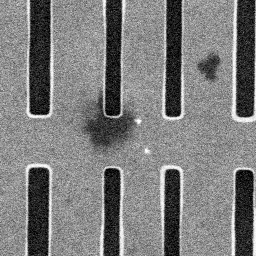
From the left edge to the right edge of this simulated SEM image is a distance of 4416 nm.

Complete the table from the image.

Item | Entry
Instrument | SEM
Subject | groups of lines, slits or small figures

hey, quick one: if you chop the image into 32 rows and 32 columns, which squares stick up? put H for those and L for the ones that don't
HHHLLLHHHHHHHLLHHHHHHLLHHHHHHLLL
HHHHLLHHHHHHHLLHHHHHHLLHHHHHHLLL
HHHHLLHHHHHHHLLHHHHHHLLHHHHHHLLL
HHHHLLHHHHHHHLLHHHHHHLLHHHHHHLLL
HHHHLLHHHHHHHLLHHHHHHLLHHHHHHLLL
HHHHLLHHHHHHHLLHHHHHHLLHHHHHHLLL
HHHLLLHHHHHHHLLHHHHHHLLHHHHHHLLL
HHHLLLHHHHHHHLLHHHHHHLLHHHHHHLLL
HHHLLLHHHHHHHLLHHHHHHLLHHHHHHLLL
HHHLLLHHHHHHHLLHHHHHHLLHHHHHHLLL
HHHLLLHHHHHHHLLHHHHHHLLHHHHHHLLL
HHHLLLHHHHHHHLLHHHHHHLLHHHHHHLLL
HHHLLLHHHHHHHLLHHHHHLLLHHHHHHLLL
HHHLLLHHHHHHHLLHHHHHLLLHHHHHHLLL
HHHHLLHHHHHHHHLHHHHHHLHHHHHHHLLL
HHHHHHHHHHHHHHHHHHHHHHHHHHHHHHHH
HHHHHHHHHHHHHHHHHHHHHHHHHHHHHHHH
HHHHHHHHHHHHHHHHHHHHHHHHHHHHHHHH
HHHHHHHHHHHHHHHHHHHHHHHHHHHHHHHH
HHHHHHHHHHHHHHHHHHHHHHHHHHHHHHHH
HHHHHHHHHHHHHHHHHHHHHHHHHHHHHHHH
HHHLLLHHHHHHHLLHHHHHLLHHHHHHHHLH
HHHLLLHHHHHHHLLHHHHHLLLHHHHHHLLL
HHHLLLHHHHHHHLLHHHHHLLLHHHHHHLLL
HHHLLLHHHHHHHLLHHHHHLLLHHHHHHLLL
HHHLLLHHHHHHHLLHHHHHLLLHHHHHHLLL
HHHLLLHHHHHHHLLHHHHHLLLHHHHHHLLL
HHHLLLHHHHHHHLLHHHHHLLLHHHHHHLLL
HHHLLLHHHHHHHLLHHHHHLLHHHHHHHLLL
HHHLLLHHHHHHHLLHHHHHLLHHHHHHHLLL
HHHLLLHHHHHHHLLHHHHHLLHHHHHHHLLL
HHHLLLHHHHHHHLLHHHHHLLLHHHHHHLLL